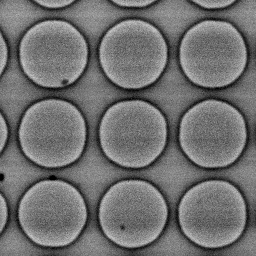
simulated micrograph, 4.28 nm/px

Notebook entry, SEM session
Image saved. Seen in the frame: an array of small figures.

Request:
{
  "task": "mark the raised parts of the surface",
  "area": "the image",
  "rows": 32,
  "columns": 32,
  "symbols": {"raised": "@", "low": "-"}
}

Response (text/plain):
-----@@@@------@@@@------@@@@---
--------------------------------
--------------------------------
----@@@@@-----@@@@@-----@@@@@---
---@@@@@@@---@@@@@@@---@@@@@@@--
@--@@@@@@@@--@@@@@@@@--@@@@@@@@-
@--@@@@@@@@--@@@@@@@@--@@@@@@@@-
@--@@@@@@@@--@@@@@@@@--@@@@@@@@-
---@@@@@@@---@@@@@@@---@@@@@@@--
----@@@@@@---@@@@@@@---@@@@@@@--
-----@@@@------@@@@------@@@@---
--------------------------------
------@-------------------------
----@@@@@-----@@@@@-----@@@@@---
---@@@@@@@---@@@@@@@---@@@@@@@--
@--@@@@@@@@--@@@@@@@@--@@@@@@@@-
@-@@@@@@@@@--@@@@@@@@--@@@@@@@@-
@--@@@@@@@@--@@@@@@@@--@@@@@@@@-
---@@@@@@@---@@@@@@@---@@@@@@@--
---@@@@@@@---@@@@@@@----@@@@@@--
-----@@@-------@@@@------@@@@---
--------------------------------
--------------------------------
----@@@@@-----@@@@@-----@@@@@---
---@@@@@@@---@@@@@@@---@@@@@@@--
@--@@@@@@@@--@@@@@@@@--@@@@@@@@-
@-@@@@@@@@@-@@@@@@@@@-@@@@@@@@@-
@-@@@@@@@@@-@@@@@@@@@-@@@@@@@@@-
---@@@@@@@---@@@@@@@---@@@@@@@--
----@@@@@@---@@@@@@@---@@@@@@@--
-----@@@-------@@@-------@@@@---
--------------------------------